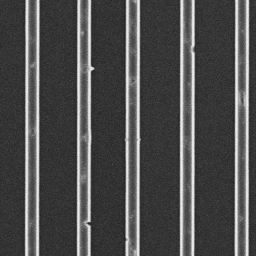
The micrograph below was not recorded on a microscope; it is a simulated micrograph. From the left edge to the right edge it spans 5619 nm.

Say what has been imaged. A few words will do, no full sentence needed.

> parallel lines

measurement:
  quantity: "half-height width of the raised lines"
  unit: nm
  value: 255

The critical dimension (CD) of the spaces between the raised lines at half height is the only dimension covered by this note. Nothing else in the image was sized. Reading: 897 nanometers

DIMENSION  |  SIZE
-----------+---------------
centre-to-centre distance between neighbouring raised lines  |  1150 nm